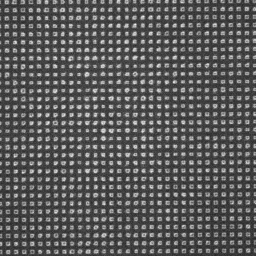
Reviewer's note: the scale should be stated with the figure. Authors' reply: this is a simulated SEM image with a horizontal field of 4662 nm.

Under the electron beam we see a regular array of raised bodies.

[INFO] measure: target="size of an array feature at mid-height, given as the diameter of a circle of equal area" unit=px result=3.57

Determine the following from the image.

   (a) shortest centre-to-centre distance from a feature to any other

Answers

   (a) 144 nanometres